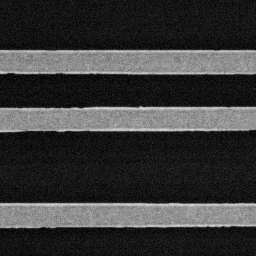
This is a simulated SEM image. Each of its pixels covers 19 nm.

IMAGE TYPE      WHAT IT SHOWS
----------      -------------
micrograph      lines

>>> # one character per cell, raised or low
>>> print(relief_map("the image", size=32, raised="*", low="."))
................................
................................
................................
................................
................................
................................
********************************
********************************
********************************
................................
................................
................................
................................
................................
********************************
********************************
................................
................................
................................
................................
................................
................................
................................
................................
................................
................................
********************************
********************************
................................
................................
................................
................................